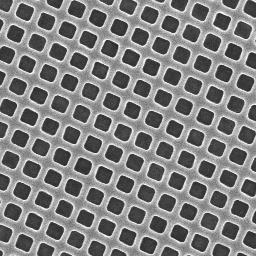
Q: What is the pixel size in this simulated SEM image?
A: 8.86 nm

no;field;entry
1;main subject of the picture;a regular array of holes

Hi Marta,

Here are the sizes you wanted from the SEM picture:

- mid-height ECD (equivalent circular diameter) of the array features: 152 nanometers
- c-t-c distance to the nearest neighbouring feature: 202 nm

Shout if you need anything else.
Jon